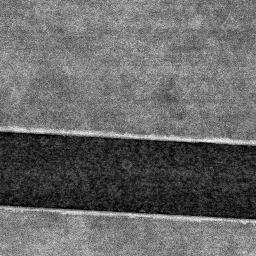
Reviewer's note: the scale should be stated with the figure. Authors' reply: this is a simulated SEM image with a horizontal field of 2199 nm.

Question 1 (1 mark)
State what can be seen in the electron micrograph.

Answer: one or a few lines or trenches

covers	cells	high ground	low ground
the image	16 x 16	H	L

HHHHHHHHHHHHHHHH
HHHHHHHHHHHHHHHH
HHHHHHHHHHHHHHHH
HHHHHHHHHHHHHHHH
HHHHHHHHHHHHHHHH
HHHHHHHHHHHHHHHH
HHHHHHHHHHHHHHHH
HHHHHHHHHHHHHHHH
LLLLLLLLHHHHHHHH
LLLLLLLLLLLLLLLL
LLLLLLLLLLLLLLLL
LLLLLLLLLLLLLLLL
LLLLLLLLLLLLLLLL
HHHHHHHHHLLLLLLL
HHHHHHHHHHHHHHHH
HHHHHHHHHHHHHHHH